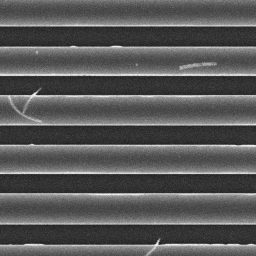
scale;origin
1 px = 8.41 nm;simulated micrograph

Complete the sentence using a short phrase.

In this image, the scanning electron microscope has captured lines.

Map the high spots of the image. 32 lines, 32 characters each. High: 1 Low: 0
11111111111111111111111111111111
11111111111111111111111111111111
11111111111111111111111111111111
00000000000000000000000000000000
00000000000000000000000000000000
00000000000000000000000000000000
11111111111111111111111111111111
11111111111111111111111111111111
11111111111111111111111111111111
00000000000000000000000000000000
00000000000000000000000000000000
00000000000000000000000000000000
11111111111111111111111111111111
11111111111111111111111111111111
11111111111111111111111111111111
11111111111111111111111111111111
00000000000000000000000000000000
00000000000000000000000000000000
11111111111111111111111111111111
11111111111111111111111111111111
11111111111111111111111111111111
11111111111111111111111111111111
00000000000000000000000000000000
00000000000000000000000000000000
11111111111111111111111111111111
11111111111111111111111111111111
11111111111111111111111111111111
11111111111111111111111111111111
00000000000000000000000000000000
00000000000000000000000000000000
00000000000000000000000000000000
11111111111111111111111111111111